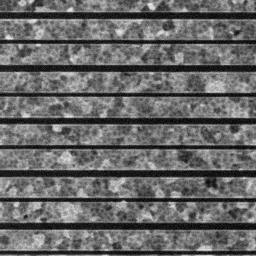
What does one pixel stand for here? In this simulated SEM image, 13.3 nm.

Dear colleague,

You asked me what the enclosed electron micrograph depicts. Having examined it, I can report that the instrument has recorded parallel lines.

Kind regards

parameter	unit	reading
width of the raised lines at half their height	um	0.261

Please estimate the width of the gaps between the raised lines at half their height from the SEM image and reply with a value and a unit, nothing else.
74.9 nm